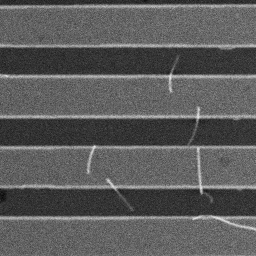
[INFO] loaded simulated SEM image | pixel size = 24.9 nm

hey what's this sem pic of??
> lines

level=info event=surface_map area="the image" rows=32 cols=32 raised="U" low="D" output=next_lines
DDDDDDDDDDDDDDDDDDDDDDDDDDDDDDDD
UUUUUUUUUUUUUUUUUUUUUUUUUUUUUUUU
UUUUUUUUUUUUUUUUUUUUUUUUUUUUUUUU
UUUUUUUUUUUUUUUUUUUUUUUUUUUUUUUU
UUUUUUUUUUUUUUUUUUUUUUUUUUUUUUUU
UUUUUUUUUUUUUUUUUUUUUUUUUUUUUUUU
DDDDDDDDDDDDDDDDDDDDDDDDDDDDDDDD
DDDDDDDDDDDDDDDDDDDDDDDDDDDDDDDD
DDDDDDDDDDDDDDDDDDDDDDDDDDDDDDDD
UDDDDDDDDDDDDDDDDDDDDUDDDDDDDDDD
UUUUUUUUUUUUUUUUUUUUUUUUUUUUUUUU
UUUUUUUUUUUUUUUUUUUUUUUUUUUUUUUU
UUUUUUUUUUUUUUUUUUUUUUUUUUUUUUUU
UUUUUUUUUUUUUUUUUUUUUUUUUUUUUUUU
UUUUUUUUUUUUUUUUUUUUUUUUUUUUUUUU
DDDDDDDDDDDDDDDDDDDDDDDDDDDDDDDD
DDDDDDDDDDDDDDDDDDDDDDDDDDDDDDDD
DDDDDDDDDDDDDDDDDDDDDDDDDDDDDDDD
UUUUUUUUUUUUUUUUUUUUUUUUUUUUUUUU
UUUUUUUUUUUUUUUUUUUUUUUUUUUUUUUU
UUUUUUUUUUUUUUUUUUUUUUUUUUUUUUUU
UUUUUUUUUUUUUUUUUUUUUUUUUUUUUUUU
UUUUUUUUUUUUUUUUUUUUUUUUUUUUUUUU
DDDDDDDDDDDDDDUDDDDDDDDDDUDDDDDU
DDDDDDDDDDDDDDDDDDDDDDDDDDDDDDDD
DDDDDDDDDDDDDDDDDDDDDDDDDDDDDDDD
DDDDDDDDDDDDDDDDDDDDDDDDDDDDDDDD
UUUUUUUUUUUUUUUUUUUUUUUUUUUUUUUU
UUUUUUUUUUUUUUUUUUUUUUUUUUUUUUUU
UUUUUUUUUUUUUUUUUUUUUUUUUUUUUUUU
UUUUUUUUUUUUUUUUUUUUUUUUUUUUUUUU
UUUUUUUUUUUUUUUUUUUUUUUUUUUUUUUU